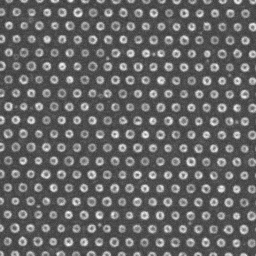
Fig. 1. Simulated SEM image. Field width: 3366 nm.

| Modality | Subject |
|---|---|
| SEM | a regular array of raised bodies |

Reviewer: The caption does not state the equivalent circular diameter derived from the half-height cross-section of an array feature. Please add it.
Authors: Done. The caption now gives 0.0984 microns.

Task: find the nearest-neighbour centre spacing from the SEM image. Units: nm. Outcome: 198